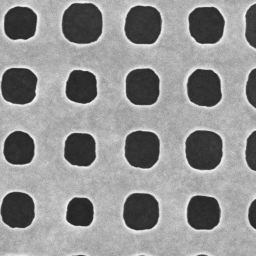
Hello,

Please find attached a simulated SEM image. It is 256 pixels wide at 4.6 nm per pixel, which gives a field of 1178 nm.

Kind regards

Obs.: a regular array of holes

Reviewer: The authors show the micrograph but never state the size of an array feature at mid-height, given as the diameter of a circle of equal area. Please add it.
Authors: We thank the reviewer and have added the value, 172 nm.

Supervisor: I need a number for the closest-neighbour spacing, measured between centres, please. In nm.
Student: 282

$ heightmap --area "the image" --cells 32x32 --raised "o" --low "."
ooooooooo...oooooooooooooooooooo
o...oooo.....ooo....oooo...oooo.
o....ooo.....ooo....oooo....ooo.
o...oooo.....ooo....oooo....ooo.
o...oooo.....ooo....oooo....ooo.
ooooooooooooooooo..oooooo.ooooo.
oooooooooooooooooooooooooooooooo
oooooooooooooooooooooooooooooooo
oooooooooooooooooooooooooooooooo
....ooooo...oooo....oooo...oooo.
.....ooo....oooo....ooo.....ooo.
.....ooo....oooo....ooo.....ooo.
o...ooooo...oooo....oooo....ooo.
oooooooooooooooooooooooooooooooo
oooooooooooooooooooooooooooooooo
oooooooooooooooooooooooooooooooo
oo.oooooooooooooo..ooooo...ooooo
o...oooo....oooo....ooo.....ooo.
....oooo....oooo....ooo.....ooo.
o...oooo....oooo....ooo.....ooo.
o..oooooo..ooooo...ooooo...oooo.
oooooooooooooooooooooooooooooooo
oooooooooooooooooooooooooooooooo
oooooooooooooooooooooooooooooooo
o...oooooooooooo...ooooo..oooooo
....ooooo...oooo....oooo...oooo.
....oooo....ooo.....ooo.....ooo.
....oooo....ooo.....ooo....oooo.
oooooooooooooooo...ooooo...ooooo
oooooooooooooooooooooooooooooooo
oooooooooooooooooooooooooooooooo
oooooooooooooooooooooooooooooooo